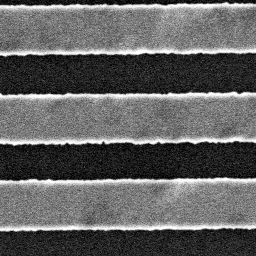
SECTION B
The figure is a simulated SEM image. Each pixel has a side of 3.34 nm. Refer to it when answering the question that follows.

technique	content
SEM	lines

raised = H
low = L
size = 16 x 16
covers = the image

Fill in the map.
HHHHHHHHHHHHHHHH
HHHHHHHHHHHHHHHH
HHHHHHHHHHHHHHHH
LLLLLLLLLLLLLLLL
LLLLLLLLLLLLLLLL
LLLLLLLLLLLLLLLL
HHHHHHHHHHHHHHHH
HHHHHHHHHHHHHHHH
HHHHHHHHHHHHHHHH
LLLLLLLLLLLLLLLL
LLLLLLLLLLLLLLLL
HHHHHHHHHHHHHHHH
HHHHHHHHHHHHHHHH
HHHHHHHHHHHHHHHH
LLLLLLLLLLLLLLLL
LLLLLLLLLLLLLLLL